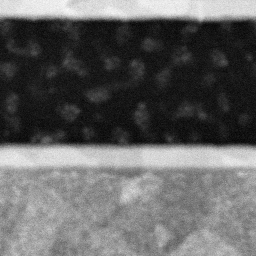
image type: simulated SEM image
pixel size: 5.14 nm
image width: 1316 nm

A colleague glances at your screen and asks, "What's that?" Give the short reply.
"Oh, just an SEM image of one or a few lines or trenches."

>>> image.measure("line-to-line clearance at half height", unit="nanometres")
778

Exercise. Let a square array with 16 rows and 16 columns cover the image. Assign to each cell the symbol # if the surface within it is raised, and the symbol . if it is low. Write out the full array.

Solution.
................
................
................
................
................
................
................
................
................
................
################
################
################
################
################
################